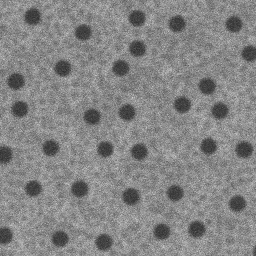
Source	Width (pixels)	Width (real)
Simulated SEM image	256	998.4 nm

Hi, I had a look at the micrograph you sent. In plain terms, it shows a regular array of holes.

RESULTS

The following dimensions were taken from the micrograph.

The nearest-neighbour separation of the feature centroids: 138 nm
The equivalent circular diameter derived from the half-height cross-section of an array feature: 19.1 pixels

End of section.